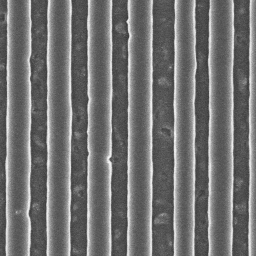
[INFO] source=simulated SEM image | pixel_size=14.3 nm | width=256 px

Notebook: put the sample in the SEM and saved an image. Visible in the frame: parallel lines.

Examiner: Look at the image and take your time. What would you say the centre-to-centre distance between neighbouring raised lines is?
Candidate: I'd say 580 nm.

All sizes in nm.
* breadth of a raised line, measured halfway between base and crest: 330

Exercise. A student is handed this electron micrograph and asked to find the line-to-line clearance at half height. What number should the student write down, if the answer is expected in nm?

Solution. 252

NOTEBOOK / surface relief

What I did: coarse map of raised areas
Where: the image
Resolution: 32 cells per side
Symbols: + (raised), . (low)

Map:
.+++..+++..+++..+++...++..+++..+
.+++..+++..+++..+++...++..+++..+
.+++..+++..+++..+++...++..+++..+
.+++..+++..+++..+++...++..+++..+
.+++..+++..+++..+++...++..+++..+
.+++..+++..+++..+++...++..+++..+
.+++..+++..+++..+++...++..+++..+
.+++..+++..+++..+++...++..+++..+
.+++..+++..+++..+++...+++.+++..+
.+++..+++..+++..+++...++..+++..+
.+++..+++..+++..+++...++..+++..+
.+++..+++..+++..+++...++..+++..+
.+++..+++..+++..+++...++..+++..+
.+++..+++..+++..+++...++..+++..+
.+++..+++..+++..+++...++..+++..+
.+++..+++..+++..+++...++..+++..+
.+++..+++..+++..+++...++..+++..+
.+++..+++..+++..+++...++..+++..+
.+++..+++..+++..+++...++..+++..+
.+++..+++..+++..+++...++..+++..+
.+++..+++..+++..+++...++..+++..+
.+++..+++..+++..+++...++..+++..+
.+++..+++..+++..+++...++..+++..+
.+++..+++..+++..+++...++..+++..+
.+++..+++..+++..+++...++..+++..+
.+++..+++..+++..+++...++..+++..+
.++...+++..+++..+++...++..+++..+
.+++..+++..+++..+++...++..+++..+
.+++..+++..+++..+++...++..+++..+
.+++..+++..+++..+++...++..+++..+
.+++..+++..+++..+++...++..+++..+
.+++..+++..+++..+++...++..+++..+